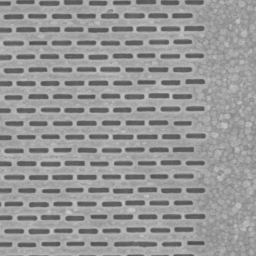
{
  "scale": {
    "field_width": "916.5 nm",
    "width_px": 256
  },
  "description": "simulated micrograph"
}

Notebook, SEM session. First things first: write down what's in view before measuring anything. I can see a regular array of holes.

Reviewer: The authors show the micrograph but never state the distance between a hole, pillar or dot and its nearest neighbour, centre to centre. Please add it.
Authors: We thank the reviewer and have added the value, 62.7 nm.